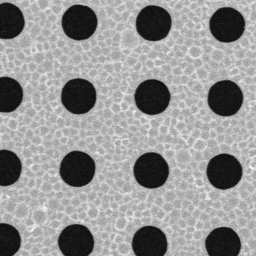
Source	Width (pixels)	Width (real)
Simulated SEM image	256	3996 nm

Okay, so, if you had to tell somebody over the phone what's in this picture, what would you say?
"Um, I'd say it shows a regular array of holes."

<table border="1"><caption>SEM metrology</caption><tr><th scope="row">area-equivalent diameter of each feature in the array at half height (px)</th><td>36.2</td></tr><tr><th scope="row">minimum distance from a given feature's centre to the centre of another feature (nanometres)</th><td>1140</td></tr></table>